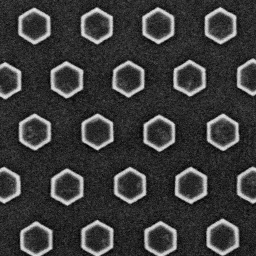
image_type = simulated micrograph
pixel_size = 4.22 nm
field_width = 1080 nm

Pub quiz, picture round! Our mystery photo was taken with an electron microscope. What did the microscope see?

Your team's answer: a regular array of raised bodies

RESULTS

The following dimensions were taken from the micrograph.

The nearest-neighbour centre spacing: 256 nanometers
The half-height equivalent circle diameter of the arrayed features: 0.134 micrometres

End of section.